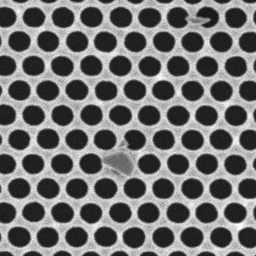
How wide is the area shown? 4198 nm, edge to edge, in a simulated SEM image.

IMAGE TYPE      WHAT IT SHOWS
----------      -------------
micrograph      a regular array of holes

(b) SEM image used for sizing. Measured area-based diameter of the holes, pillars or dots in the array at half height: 364 nm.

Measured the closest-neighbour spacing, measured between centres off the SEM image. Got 459 nm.